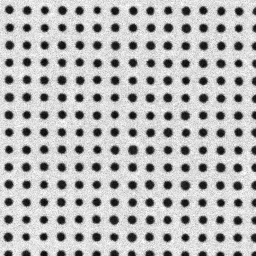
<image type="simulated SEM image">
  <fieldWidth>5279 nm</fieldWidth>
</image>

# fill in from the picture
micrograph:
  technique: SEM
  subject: a regular array of holes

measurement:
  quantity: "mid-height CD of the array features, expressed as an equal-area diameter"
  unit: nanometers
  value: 179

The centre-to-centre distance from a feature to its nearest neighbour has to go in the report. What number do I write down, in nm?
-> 354